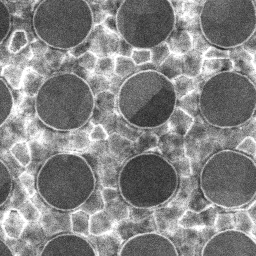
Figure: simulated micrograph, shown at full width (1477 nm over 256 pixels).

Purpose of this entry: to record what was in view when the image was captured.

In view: raised bodies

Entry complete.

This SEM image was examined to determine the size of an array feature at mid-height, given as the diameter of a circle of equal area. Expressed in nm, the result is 332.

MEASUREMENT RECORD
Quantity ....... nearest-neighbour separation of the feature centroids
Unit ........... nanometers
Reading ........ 464